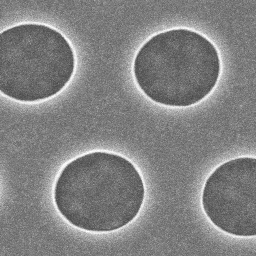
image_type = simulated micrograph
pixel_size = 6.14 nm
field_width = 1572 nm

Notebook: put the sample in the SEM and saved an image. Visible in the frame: holes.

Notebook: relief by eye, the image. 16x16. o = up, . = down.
oooooooooooooooo
oooooooooooooooo
....ooooo....ooo
.....oooo.....oo
.....ooo......oo
....ooooo....ooo
oooooooooo..oooo
oooooooooooooooo
oooooooooooooooo
oooooo.ooooooooo
oooo....oooooo..
ooo......oooo...
ooo......oooo...
oooo....ooooo...
oooooooooooooo..
oooooooooooooooo